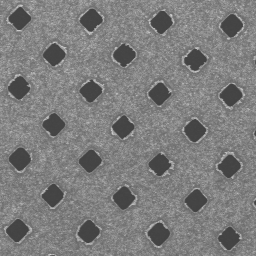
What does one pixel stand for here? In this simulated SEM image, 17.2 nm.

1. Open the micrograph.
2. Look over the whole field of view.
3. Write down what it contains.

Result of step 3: a regular array of holes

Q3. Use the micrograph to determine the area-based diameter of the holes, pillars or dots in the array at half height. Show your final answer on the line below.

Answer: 0.354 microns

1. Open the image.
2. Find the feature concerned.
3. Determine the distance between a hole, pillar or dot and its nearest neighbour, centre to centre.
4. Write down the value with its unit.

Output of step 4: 834 nanometres